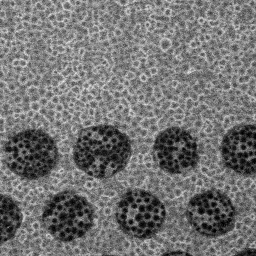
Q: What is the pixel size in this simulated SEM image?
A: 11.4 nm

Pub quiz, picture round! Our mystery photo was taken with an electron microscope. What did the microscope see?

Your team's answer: raised bodies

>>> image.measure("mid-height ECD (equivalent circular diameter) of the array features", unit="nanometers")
514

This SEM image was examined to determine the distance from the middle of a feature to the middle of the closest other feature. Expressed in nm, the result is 799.